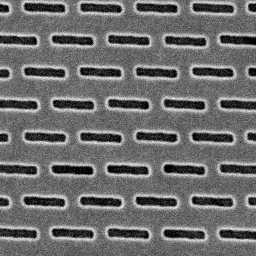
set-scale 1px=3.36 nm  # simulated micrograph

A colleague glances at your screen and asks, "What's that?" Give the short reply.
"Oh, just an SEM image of a regular array of holes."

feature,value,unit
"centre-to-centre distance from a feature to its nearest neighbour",0.142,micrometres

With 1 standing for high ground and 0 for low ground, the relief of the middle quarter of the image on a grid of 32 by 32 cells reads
11111111111111111111111111111111
11110000000000111100000000001111
11110000000000011100000000001111
11111111111111111111111111001111
11111111111111111111111111111111
11111111111111111111111111111111
11111111111111111111111111111111
11111111111111111111111111111111
11111111111111111111111111111111
00000001111000000000011110000000
00000000111000000000011110000000
11100001111111111110011111111111
11111111111111111111111111111111
11111111111111111111111111111111
11111111111111111111111111111111
11111111111111111111111111111111
11111111111111111111111111111111
11110000000001111100000000001111
01110000000000011100000000001111
11111111100000111111111111001111
11111111111111111111111111111111
11111111111111111111111111111111
11111111111111111111111111111111
11111111111111111111111111111111
11111111111111111111111111111111
00000011111000000000111110000000
00000001111000000000011110000000
00000001111100000000011111110000
11111111111111111111111111111111
11111111111111111111111111111111
11111111111111111111111111111111
11111111111111111111111111111111